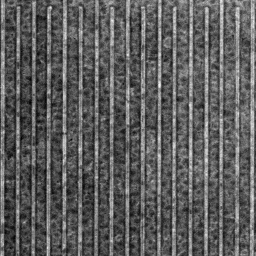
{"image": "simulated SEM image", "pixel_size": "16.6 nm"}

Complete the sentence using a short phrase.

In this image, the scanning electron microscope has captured parallel lines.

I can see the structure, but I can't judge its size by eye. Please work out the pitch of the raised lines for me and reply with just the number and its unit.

258 nm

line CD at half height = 0.0455 microns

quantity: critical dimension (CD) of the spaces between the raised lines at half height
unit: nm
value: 213